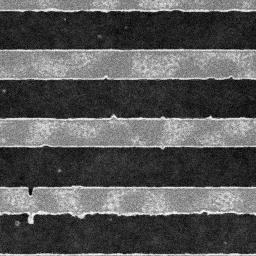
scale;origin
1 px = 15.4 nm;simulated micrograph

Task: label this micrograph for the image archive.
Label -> one or a few lines or trenches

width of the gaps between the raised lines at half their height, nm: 622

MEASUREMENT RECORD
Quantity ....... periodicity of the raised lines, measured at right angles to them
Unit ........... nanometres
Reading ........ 1050